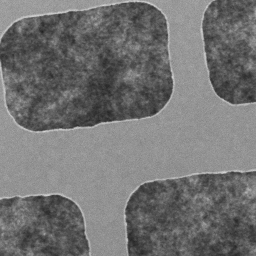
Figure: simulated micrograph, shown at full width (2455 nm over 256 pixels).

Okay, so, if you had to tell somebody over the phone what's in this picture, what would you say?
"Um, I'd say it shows holes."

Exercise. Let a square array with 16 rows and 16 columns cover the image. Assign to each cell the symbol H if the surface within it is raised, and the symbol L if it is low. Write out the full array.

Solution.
HHHHHHLLLLHHHLLL
HLLLLLLLLLHHHLLL
LLLLLLLLLLLHHLLL
LLLLLLLLLLLHHLLL
LLLLLLLLLLLHHLLL
LLLLLLLLLLLHHLLL
LLLLLLLLLLHHHHHH
HLLLLLLLHHHHHHHH
HHHHHHHHHHHHHHHH
HHHHHHHHHHHHHHHH
HHHHHHHHHHHHHHHH
HHHHHHHHHLLLLLLL
LLLLHHHHLLLLLLLL
LLLLLHHHLLLLLLLL
LLLLLHHHLLLLLLLL
LLLLLLHHLLLLLLLL